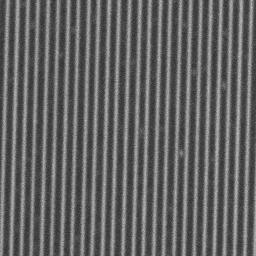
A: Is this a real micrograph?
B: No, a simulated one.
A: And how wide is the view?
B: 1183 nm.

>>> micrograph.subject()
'parallel lines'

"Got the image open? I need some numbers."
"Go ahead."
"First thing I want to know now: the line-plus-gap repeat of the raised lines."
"0.0469 µm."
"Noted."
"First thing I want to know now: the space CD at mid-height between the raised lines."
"36.4 nanometers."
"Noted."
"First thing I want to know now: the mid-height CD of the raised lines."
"12.1 nanometers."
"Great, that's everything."